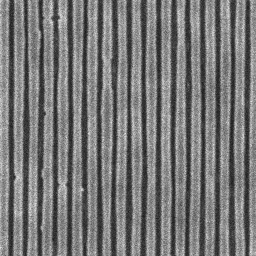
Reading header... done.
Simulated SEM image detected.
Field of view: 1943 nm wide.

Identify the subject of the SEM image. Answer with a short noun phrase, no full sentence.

parallel lines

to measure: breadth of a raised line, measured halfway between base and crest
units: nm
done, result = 63.6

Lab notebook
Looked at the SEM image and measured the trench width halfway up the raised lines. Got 49.4 nm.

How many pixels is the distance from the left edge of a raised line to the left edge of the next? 14.7